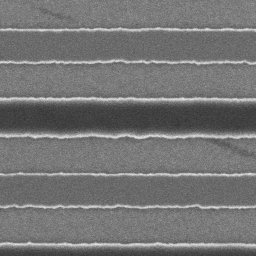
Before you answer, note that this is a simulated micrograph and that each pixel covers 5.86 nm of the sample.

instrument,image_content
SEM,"lines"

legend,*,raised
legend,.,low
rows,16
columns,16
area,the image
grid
................
................
****************
****************
................
................
****************
****************
****************
................
................
****************
****************
................
................
****************